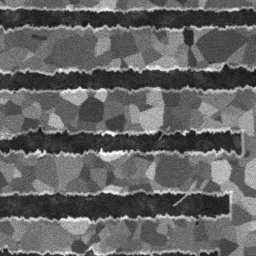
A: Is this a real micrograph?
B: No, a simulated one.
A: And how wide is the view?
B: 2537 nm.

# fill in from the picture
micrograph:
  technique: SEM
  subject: one or a few lines or trenches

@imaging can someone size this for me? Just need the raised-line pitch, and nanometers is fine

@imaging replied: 619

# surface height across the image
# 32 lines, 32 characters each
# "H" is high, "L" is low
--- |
HHHHHHHHHHHHHHHHHHHHHHHHHHHHHHHH
LLLLLLLLLLLLLLLLLLLLLLLLLLLLLLLL
LLLLLLLLLLLLLLLLLLLLLLLLLLLLLLLL
LLLHLHLHLHLLLHHLLLHLLLLHHHHHHHHH
HHHHHHHHHHHHHHHHHHHHHHHHHHHHHHHH
HHHHHHHHHHHHHHHHHHHHHHHHHHHHHHHH
HHHHHHHHHHHHHHHHHHHHHHHHHHHHHHHH
HHHHHHHHHHHHHHHHHHHHHHHHHHHHHHHH
HHHHHHHHHHHHHHHHLHHHHHHHHHHHLLLH
LLLLLLLLLLLLLLLLLLLLLLLLLLLLLLLL
LLLLLLLLLLLLLLLLLLLLLLLLLLLLLLLL
HHHHHHHHHHHHHHHHHHHHHHHHHHHHHHHH
HHHHHHHHHHHHHHHHHHHHHHHHHHHHHHHH
HHHHHHHHHHHHHHHHHHHHHHHHHHHHHHHH
HHHHHHHHHHHHHHHHHHHHHHHHHHHHHHHH
HHHHHHHHHHHHHHHHHHHHHHHHHHHHHHHH
HHHLLLHLLHLHHHHHHHLLHHLLLLLLLLHH
LLLLLLLLLLLLLLLLLLLLLLLLLLLLLLHH
LLLLLLLLLLLLLLLLLLLLLLLLLLLLLLHH
HHHHHHHHHHHHHHHHHHHHHHHHHHHHHHHH
HHHHHHHHHHHHHHHHHHHHHHHHHHHHHHHH
HHHHHHHHHHHHHHHHHHHHHHHHHHHHHHHH
HHHHHHHHHHHHHHHHHHHHHHHHHHHHHHHH
HHHHHHHHHHHHHHHHHHHHHHHHHHHHHHHH
LLLLLLLLLLLLLLLLLLLLLLLLLLLLLHHH
LLLLLLLLLLLLLLLLLLLLLLLLLLLLLHHH
LLLLLLLLLLLLLLLLLLLLLLLLLLLLLHHH
HHHHHHLLHLHLLHHHHHHHHHHHHHHHHHHH
HHHHHHHHHHHHHHHHHHHHHHHHHHHHHHHH
HHHHHHHHHHHHHHHHHHHHHHHHHHHHHHHH
HHHHHHHHHHHHHHHHHHHHHHHHHHHHHHHH
LHLHHHHHHHHLHHHHHHHHHLLHHLLHHHHH